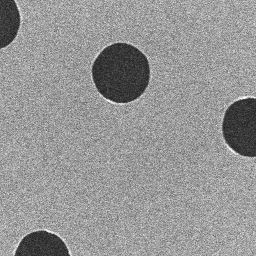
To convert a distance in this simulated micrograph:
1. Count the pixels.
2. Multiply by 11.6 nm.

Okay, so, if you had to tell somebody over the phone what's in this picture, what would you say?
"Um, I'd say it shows holes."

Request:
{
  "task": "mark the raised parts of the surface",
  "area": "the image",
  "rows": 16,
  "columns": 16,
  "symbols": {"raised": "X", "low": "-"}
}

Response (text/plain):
-XXXXXXXXXXXXXXX
-XXXXXXXXXXXXXXX
-XXXXXXXXXXXXXXX
XXXXXX---XXXXXXX
XXXXXX---XXXXXXX
XXXXXX---XXXXXXX
XXXXXXXXXXXXXXX-
XXXXXXXXXXXXXX--
XXXXXXXXXXXXXX--
XXXXXXXXXXXXXXX-
XXXXXXXXXXXXXXXX
XXXXXXXXXXXXXXXX
XXXXXXXXXXXXXXXX
XXXXXXXXXXXXXXXX
XX-XXXXXXXXXXXXX
X---XXXXXXXXXXXX